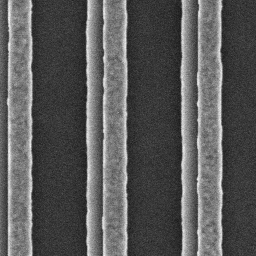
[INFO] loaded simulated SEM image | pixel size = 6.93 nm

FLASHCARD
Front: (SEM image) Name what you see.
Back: lines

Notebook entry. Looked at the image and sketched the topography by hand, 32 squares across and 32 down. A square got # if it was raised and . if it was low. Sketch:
####.......#####.......#####....
####.......#####.......#####....
####.......#####.......####.....
####.......#####.......#####....
####.......#####.......#####....
####.......#####.......####.....
####.......#####.......####.....
####.......#####.......#####....
####.......#####.......#####....
####.......#####.......#####....
####.......#####.......#####....
####.......#####.......#####....
####.......#####.......#####....
####.......#####.......####.....
####.......#####.......####.....
####.......#####.......#####....
####.......#####.......#####....
####.......#####.......#####....
####.......#####.......#####....
####.......#####.......#####....
####.......#####.......#####....
####.......#####.......#####....
####.......#####.......#####....
####.......#####.......#####....
####.......#####.......#####....
####.......#####.......#####....
####.......#####.......#####....
####.......#####.......#####....
####.......#####.......#####....
####.......#####.......#####....
####.......#####.......#####....
####.......#####.......#####....